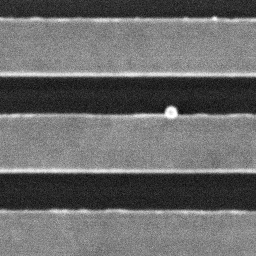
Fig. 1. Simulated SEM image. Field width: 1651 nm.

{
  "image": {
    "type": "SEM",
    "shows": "lines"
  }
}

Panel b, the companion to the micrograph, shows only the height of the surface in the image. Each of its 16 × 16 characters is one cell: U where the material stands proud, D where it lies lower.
DDDDDDDDDDDDDDDD
UUUUUUUUUUUUUUUU
UUUUUUUUUUUUUUUU
UUUUUUUUUUUUUUUU
UUUUUUUUUUUUUUUU
DDDDDDDDDDDDDDDD
DDDDDDDDDDDDDDDD
UUUUUUUUUUUUUUUU
UUUUUUUUUUUUUUUU
UUUUUUUUUUUUUUUU
UUUUUUUUUUUUUUUU
DDDDDDDDDDDDDDDD
DDDDDDDDDDDDDDDD
UUUUUUUUUUUUUUUU
UUUUUUUUUUUUUUUU
UUUUUUUUUUUUUUUU